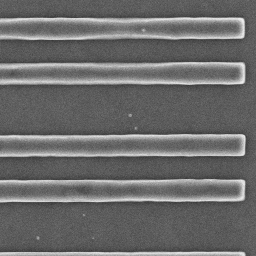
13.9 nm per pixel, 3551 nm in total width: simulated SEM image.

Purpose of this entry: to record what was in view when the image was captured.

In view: wiring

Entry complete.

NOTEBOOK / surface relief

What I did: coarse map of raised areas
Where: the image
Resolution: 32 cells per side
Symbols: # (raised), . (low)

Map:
................................
................................
..##########.......###########..
##############################..
##############################..
................................
................................
................................
###############################.
###############################.
................................
................................
................................
................................
................................
................................
................................
###############################.
###############################.
.......................##.......
................................
................................
.....................#######....
###############################.
##############################..
................................
................................
................................
................................
................................
................................
................................